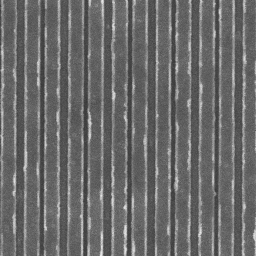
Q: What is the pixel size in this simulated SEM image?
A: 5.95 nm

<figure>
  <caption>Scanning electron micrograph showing parallel lines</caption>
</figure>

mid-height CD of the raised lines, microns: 0.0892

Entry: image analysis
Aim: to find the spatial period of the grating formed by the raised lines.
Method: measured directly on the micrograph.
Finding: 130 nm